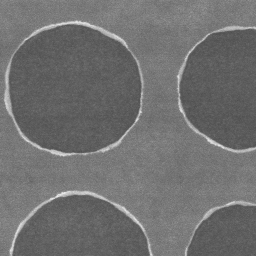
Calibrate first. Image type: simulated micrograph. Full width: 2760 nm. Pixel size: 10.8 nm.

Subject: holes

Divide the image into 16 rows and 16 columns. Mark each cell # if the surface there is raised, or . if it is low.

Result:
################
################
##.....######...
#.......####....
#........##.....
.........##.....
#........##.....
#.......####....
##......#####...
####..##########
################
################
###...##########
##......#####...
#........###....
#........###....